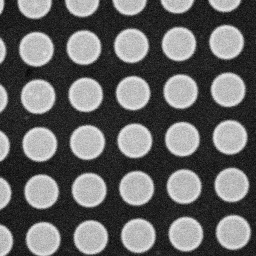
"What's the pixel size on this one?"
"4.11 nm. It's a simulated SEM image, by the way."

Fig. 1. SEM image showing an array of small figures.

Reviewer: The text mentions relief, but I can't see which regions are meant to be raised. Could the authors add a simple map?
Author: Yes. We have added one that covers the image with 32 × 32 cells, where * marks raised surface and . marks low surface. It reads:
..****..****..****..****..****..
...***...***...**....**.........
................................
......................*....**...
...***...***...***...***..****..
*..****.*****.*****.****..****..
*..****.*****.****...***...***..
...***...***...***....*.........
................................
......................*....***..
...***...***...***...****..****.
*..****..****..****.*****.*****.
*..****..****..****..***...***..
*..***...***....**....*.........
................................
................*.....**...***..
....**...****..****..****..****.
*..****..****..****..****..****.
*..****..****..****..****..***..
*..****...**....**....*.........
................................
................**....**....**..
*...***..****..****..****..****.
*..****..****..****..****..****.
*..****..****..****..****..****.
*...***...**....**..............
................................
................**....**....***.
*...***...***..****..****..****.
*..****..****..****..****..****.
**.****..****..****...***...***.
*...***...**.....*..............